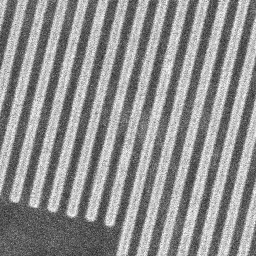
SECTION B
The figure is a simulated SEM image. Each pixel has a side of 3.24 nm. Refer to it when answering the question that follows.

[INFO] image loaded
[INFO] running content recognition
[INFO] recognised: parallel lines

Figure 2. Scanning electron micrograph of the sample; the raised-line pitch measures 63.4 nm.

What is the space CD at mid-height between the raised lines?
0.0358 um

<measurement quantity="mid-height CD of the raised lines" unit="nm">24.8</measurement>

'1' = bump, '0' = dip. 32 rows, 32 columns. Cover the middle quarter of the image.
11000110001100011000110001100011
11000110001100011000110001100011
10001110011100111001100011100111
10001100011000110001100011000110
10001100011000110001100011000110
10001100011000110001100011000110
00011100111001110001000111001110
00011000110001100011000110001100
00011000110001100011000110001100
00011000110001100011000110001100
00111001110001000010001110011100
00110001100011000110001100011000
00110001100011000110001100011000
01110001100011000110001100011000
01110011100010000100011100111000
01100011000110001100011000111001
01100011000110001100011000110001
01100011000110001100011000110001
11100011000110001000111001110001
11000110001100011000110001110011
11000110001100011000110001100011
11000110001100011000110001100011
11000110001100011001110011100011
10001100011000110001110011100110
10001100011000110001100011000110
10001100011000110001100011000110
10001100011000110011100111000110
00011000110001100011000111001100
00011000110001100011000110001100
00011000110001100011000110001100
00011000110001100011000110001100
00110001100011000111001110001000